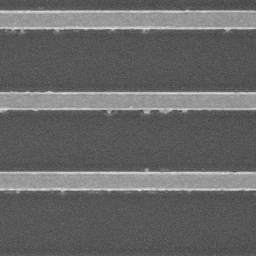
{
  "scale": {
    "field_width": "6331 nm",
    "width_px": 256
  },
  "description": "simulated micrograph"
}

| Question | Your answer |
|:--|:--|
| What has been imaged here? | lines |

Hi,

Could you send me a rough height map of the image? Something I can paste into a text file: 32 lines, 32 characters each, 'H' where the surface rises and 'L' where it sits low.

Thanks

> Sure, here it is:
LLLLLLLLLLLLLLLLLLLLLLLLLLLLLLLL
HHHHHHHHHHHHHHHHHHHHHHHHHHHHHHHH
HHHHHHHHHHHHHHHHHHHHHHHHHHHHHHHH
HHHHHHHHHHHHHHHHHHHHHHHHHHHHHHHH
LLLLLLLLLLLLLLLLLLLLLLLLLLLLLLLL
LLLLLLLLLLLLLLLLLLLLLLLLLLLLLLLL
LLLLLLLLLLLLLLLLLLLLLLLLLLLLLLLL
LLLLLLLLLLLLLLLLLLLLLLLLLLLLLLLL
LLLLLLLLLLLLLLLLLLLLLLLLLLLLLLLL
LLLLLLLLLLLLLLLLLLLLLLLLLLLLLLLL
LLLLLLLLLLLLLLLLLLLLLLLLLLLLLLLL
LLLLLLLLLLLLLLLLLLLLLLLLLLLLLLLL
HHHHHHHHHHHHHHHHHHHHHHHHHHHHHHHH
HHHHHHHHHHHHHHHHHHHHHHHHHHHHHHHH
LLLLLLLLLLLLLLLLLLLLLLLLLLLLLLLL
LLLLLLLLLLLLLLLLLLLLLLLLLLLLLLLL
LLLLLLLLLLLLLLLLLLLLLLLLLLLLLLLL
LLLLLLLLLLLLLLLLLLLLLLLLLLLLLLLL
LLLLLLLLLLLLLLLLLLLLLLLLLLLLLLLL
LLLLLLLLLLLLLLLLLLLLLLLLLLLLLLLL
LLLLLLLLLLLLLLLLLLLLLLLLLLLLLLLL
LLLLLLLLLLLLLLLLLLLLLLLLLLLLLLLL
HHHHHHHHHHHHHHHHHHHHHHHHHHHHHHHH
HHHHHHHHHHHHHHHHHHHHHHHHHHHHHHHH
LLLLLLLLLLLLLLLLLLLLLLLLLLLLLLLL
LLLLLLLLLLLLLLLLLLLLLLLLLLLLLLLL
LLLLLLLLLLLLLLLLLLLLLLLLLLLLLLLL
LLLLLLLLLLLLLLLLLLLLLLLLLLLLLLLL
LLLLLLLLLLLLLLLLLLLLLLLLLLLLLLLL
LLLLLLLLLLLLLLLLLLLLLLLLLLLLLLLL
LLLLLLLLLLLLLLLLLLLLLLLLLLLLLLLL
LLLLLLLLLLLLLLLLLLLLLLLLLLLLLLLL